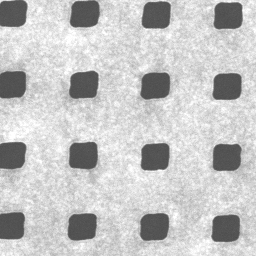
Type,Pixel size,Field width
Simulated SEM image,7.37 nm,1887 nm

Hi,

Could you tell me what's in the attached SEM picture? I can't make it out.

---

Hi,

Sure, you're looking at a regular array of holes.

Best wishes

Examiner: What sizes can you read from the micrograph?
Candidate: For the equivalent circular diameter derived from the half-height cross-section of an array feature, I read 223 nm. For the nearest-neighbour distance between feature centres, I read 520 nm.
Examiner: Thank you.